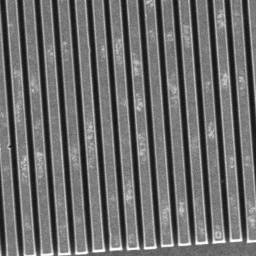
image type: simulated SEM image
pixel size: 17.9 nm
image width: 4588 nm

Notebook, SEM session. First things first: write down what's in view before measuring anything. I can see parallel lines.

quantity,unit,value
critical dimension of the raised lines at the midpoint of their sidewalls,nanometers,201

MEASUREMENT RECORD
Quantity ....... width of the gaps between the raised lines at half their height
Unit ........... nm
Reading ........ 116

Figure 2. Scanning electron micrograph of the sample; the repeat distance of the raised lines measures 309 nanometers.